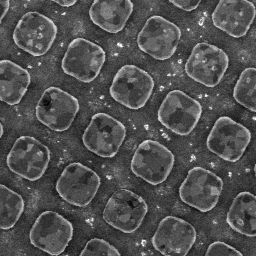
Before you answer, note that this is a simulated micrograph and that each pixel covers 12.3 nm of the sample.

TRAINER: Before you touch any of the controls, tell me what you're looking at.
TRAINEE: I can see a regular array of raised bodies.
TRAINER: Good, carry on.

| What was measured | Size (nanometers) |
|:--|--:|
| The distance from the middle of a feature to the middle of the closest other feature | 678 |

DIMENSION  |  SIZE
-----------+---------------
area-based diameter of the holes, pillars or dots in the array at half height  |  0.5 um